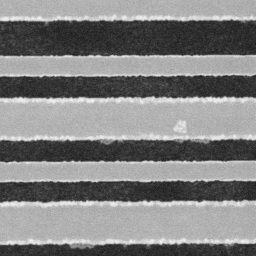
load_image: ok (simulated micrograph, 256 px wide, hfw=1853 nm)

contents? lines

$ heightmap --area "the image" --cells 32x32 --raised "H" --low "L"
HHHHHHHHHHHHHHHHHHHHHHHHHHHHHHHH
HHHHHHHHHHHHHHHHHHHHHHHHHHHHHHHH
LLLLLHLLLLLLLLLLLLLLLLLLLLLLLLLL
LLLLLLLLLLLLLLLLLLLLLLLLLLLLLLLL
LLLLLLLLLLLLLLLLLLLLLLLLLLLLLLLL
LLLLLLLLLLLLLLLLLLLLLLLLLLLLLLLL
LLLLLLLLLLLLLLLLLLLLLLLLLLLLLLLL
HHHHHHHHHHHHHHHHHHHHHHHHHHHHHHHH
HHHHHHHHHHHHHHHHHHHHHHHHHHHHHHHH
LLLLLLLLLLLLLHLLLLLLLLLLLLLLLLLL
LLLLLLLLLLLLLLLLLLLLLLLLLLLLLLLL
LLLLLLLLLLLLLLLLLLLLLLLLLLLLLLLL
HHHHHHHHHHHHHHHHHHHHHHHHHHHHHHHH
HHHHHHHHHHHHHHHHHHHHHHHHHHHHHHHH
HHHHHHHHHHHHHHHHHHHHHHHHHHHHHHHH
HHHHHHHHHHHHHHHHHHHHHHHHHHHHHHHH
HHHHHHHHHHHHHHHHHHHHHHHHHHHHHHHH
LLLLLLLLLLLLLHLLLLLLLLLLLHLLLLLL
LLLLLLLLLLLLLLLLLLLLLLLLLLLLLLLL
LLLLLLLLLLLLLLLLLLLLLLLLLLLLLLLL
HHHHHHHHHHHHHHHHHHHHHHHHHHHHHHHH
HHHHHHHHHHHHHHHHHHHHHHHHHHHHHHHH
HHHHHHHHHHHHHHHHHHHHHHHHHHHHHHHH
LLLLLLLLLLLLLLLLLLLLLLLLLLLLLLLL
LLLLLLLLLLLLLLLLLLLLLLLLLLLLLLLL
HHHHHLHHHHHHHHHHHHHHHHHHHHHHHHHH
HHHHHHHHHHHHHHHHHHHHHHHHHHHHHHHH
HHHHHHHHHHHHHHHHHHHHHHHHHHHHHHHH
HHHHHHHHHHHHHHHHHHHHHHHHHHHHHHHH
HHHHHHHHHHHHHHHHHHHHHHHHHHHHHHHH
HLLLLLLLLHHHLLLLLLLLLLLLLLLLLLLL
LLLLLLLLLLLLLLLLLLLLLLLLLLLLLLLL